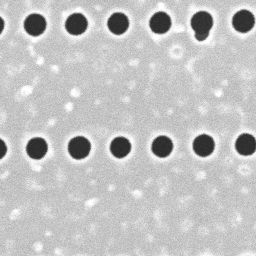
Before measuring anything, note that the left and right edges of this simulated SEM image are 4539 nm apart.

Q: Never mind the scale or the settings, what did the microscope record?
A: a regular array of holes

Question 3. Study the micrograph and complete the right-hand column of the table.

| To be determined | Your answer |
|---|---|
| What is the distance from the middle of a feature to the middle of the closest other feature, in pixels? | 41.5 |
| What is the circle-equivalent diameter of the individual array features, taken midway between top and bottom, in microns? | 0.423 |